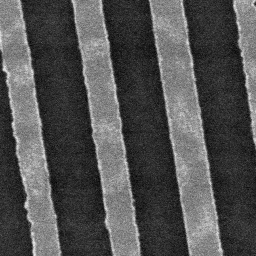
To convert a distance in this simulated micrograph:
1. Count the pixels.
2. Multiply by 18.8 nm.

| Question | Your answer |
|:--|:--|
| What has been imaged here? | one or a few lines or trenches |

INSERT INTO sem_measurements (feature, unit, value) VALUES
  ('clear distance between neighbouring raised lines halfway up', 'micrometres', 0.939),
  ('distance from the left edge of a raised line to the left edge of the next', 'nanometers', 1470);